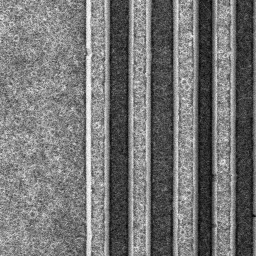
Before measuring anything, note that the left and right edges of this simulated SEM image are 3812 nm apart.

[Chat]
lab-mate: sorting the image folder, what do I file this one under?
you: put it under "parallel lines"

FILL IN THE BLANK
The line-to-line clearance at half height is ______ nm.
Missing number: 326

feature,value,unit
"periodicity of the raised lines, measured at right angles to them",0.625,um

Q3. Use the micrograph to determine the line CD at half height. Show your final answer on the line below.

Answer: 19.4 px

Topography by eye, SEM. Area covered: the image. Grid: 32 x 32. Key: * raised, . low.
...........**...***...***..**...
...........**...***...***..**...
...........**...***...***..**...
...........**...***...***..**...
...........**...***...***..**...
...........**...***...***..**...
...........**...***...***..**...
...........**...***...***..**...
...........**...***...***..**...
...........**...***...***..**...
...........**...***...***..**...
...........**...***...**...**...
...........**...***...**...**...
...........**...**....**...**...
...........**...**....**...**...
...........**...**....**...**...
...........**...**....**...**...
...........**...***...**...**...
...........**...***...**...**...
...........**...***...**...**...
...........**...***...**...**...
...........**...***...**...**...
...........**...***...**...**...
...........**...**....**...**...
...........**...**....**...**...
...........**...**....**...**...
...........**...**....**...**...
...........**...**....**...**...
...........**...**....**...**...
...........**...**....**...**...
...........**...**....**...**...
...........**...**....**...**...